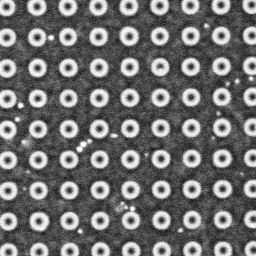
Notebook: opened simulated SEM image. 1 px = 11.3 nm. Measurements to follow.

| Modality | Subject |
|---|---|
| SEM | an array of small figures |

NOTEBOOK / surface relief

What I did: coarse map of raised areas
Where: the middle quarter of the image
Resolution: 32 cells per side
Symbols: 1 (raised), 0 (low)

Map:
11100001111000111100001111000011
11100001111000111100001111000011
11100001110000011100000110000011
00000000000000000000000000000000
00000000000000000000000000000000
00000000000000000000000000000000
00000000000000001000000110000001
11100001111000011100001111000011
11100001111000111110001111000011
11100001111000011100001111000011
11000000100000001000000000000000
00000000000000000000000000000000
00000000000000000000000000000000
00000000000000000000000000000000
11000000110000011100000111000011
11100001111000011100001111000011
11100001111000011100001111000011
11100001111000011100000111000011
00000000000000000000000000000000
00000000000000000000000000000000
00000000000000000000000000000000
00000000000000000000000000000000
11100001110000011100000111000011
11100001111000011110001111000011
11100001111000011110001111000011
11100000110000011100000110000001
00000000000000000000000000000000
00000000000000000000000000000000
00000000000000000000000000000000
00000000000000001000000110000001
11100001111000011100001111000011
11100001111000011110001111000011